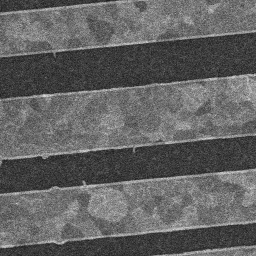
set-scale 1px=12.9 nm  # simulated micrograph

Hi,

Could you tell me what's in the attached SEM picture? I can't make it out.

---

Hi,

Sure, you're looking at one or a few lines or trenches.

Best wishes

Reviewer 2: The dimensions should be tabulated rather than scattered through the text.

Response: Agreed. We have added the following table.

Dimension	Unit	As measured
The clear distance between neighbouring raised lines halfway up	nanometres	465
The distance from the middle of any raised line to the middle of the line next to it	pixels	91.6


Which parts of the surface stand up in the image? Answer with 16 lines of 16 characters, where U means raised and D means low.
DDDDUUUUUUUUUUUU
UUUUUUUUUUUUUUUU
UUUUUUUUUUUDDDDD
DDDDDDDDDDDDDDDD
DDDDDDDDDDDDDDDD
DDDDDDDDUUUUUUUU
UUUUUUUUUUUUUUUU
UUUUUUUUUUUUUUUU
UUUUUUUUUUUUUUUD
UUUUDDDDDDDDDDDD
DDDDDDDDDDDDDDDD
DDDDDDDUUUUUUUUU
UUUUUUUUUUUUUUUU
UUUUUUUUUUUUUUUU
UUUUUUUUUDDDDDDD
DDDDDDDDDDDDDDDU